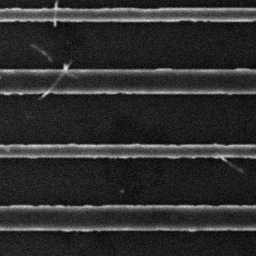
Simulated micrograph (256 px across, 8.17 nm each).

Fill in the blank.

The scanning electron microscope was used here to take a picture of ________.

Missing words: lines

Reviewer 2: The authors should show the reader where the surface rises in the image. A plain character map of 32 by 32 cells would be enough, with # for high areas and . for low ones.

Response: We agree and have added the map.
................................
################################
################################
................................
................................
................................
................................
................................
................................
################################
################################
################################
................................
................................
................................
................................
................................
................................
################################
################################
................................
................................
................................
................................
................................
................................
################################
################################
################################
................................
................................
................................